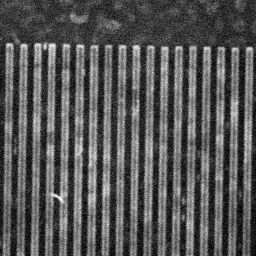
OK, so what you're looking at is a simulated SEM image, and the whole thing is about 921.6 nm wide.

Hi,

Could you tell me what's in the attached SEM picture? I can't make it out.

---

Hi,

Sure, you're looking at parallel lines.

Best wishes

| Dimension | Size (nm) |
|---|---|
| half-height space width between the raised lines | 32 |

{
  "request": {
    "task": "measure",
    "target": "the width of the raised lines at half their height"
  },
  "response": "19.4 nm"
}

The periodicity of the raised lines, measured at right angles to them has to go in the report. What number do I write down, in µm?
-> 0.0508